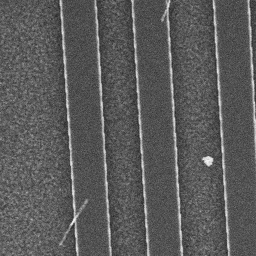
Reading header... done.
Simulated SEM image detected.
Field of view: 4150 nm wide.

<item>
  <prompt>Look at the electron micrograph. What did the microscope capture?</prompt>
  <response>lines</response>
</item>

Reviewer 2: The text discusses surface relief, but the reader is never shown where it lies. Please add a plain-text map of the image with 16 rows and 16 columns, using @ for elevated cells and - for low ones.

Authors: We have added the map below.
----@@--@@@--@@@
----@@--@@@--@@@
----@@--@@@--@@@
----@@--@@@---@@
----@@---@@---@@
----@@---@@---@@
----@@---@@---@@
----@@---@@---@@
----@@@--@@---@@
----@@@--@@---@@
----@@@--@@---@@
----@@@--@@---@@
-----@@--@@---@@
-----@@--@@---@@
-----@@--@@---@@
-----@@--@@---@@